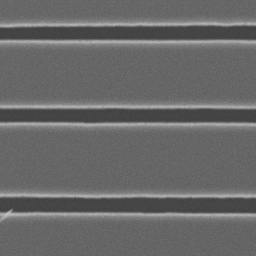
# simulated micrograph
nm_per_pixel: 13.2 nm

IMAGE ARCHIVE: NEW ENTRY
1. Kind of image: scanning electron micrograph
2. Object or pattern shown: lines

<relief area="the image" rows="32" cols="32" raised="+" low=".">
++++++++++++++++++++++++++++++++
++++++++++++++++++++++++++++++++
++++++++++++++++++++++++++++++++
................................
................................
++++++++++++++++++++++++++++++++
++++++++++++++++++++++++++++++++
++++++++++++++++++++++++++++++++
++++++++++++++++++++++++++++++++
++++++++++++++++++++++++++++++++
++++++++++++++++++++++++++++++++
++++++++++++++++++++++++++++++++
++++++++++++++++++++++++++++++++
.............................+++
................................
++++++++++++++++++++++++++++++++
++++++++++++++++++++++++++++++++
++++++++++++++++++++++++++++++++
++++++++++++++++++++++++++++++++
++++++++++++++++++++++++++++++++
++++++++++++++++++++++++++++++++
++++++++++++++++++++++++++++++++
++++++++++++++++++++++++++++++++
++++++++++++++++++++++++++++++++
++++++++++++++++++++++++++++++++
................................
.+..............................
++++++++++++++++++++++++++++++++
++++++++++++++++++++++++++++++++
++++++++++++++++++++++++++++++++
++++++++++++++++++++++++++++++++
++++++++++++++++++++++++++++++++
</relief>